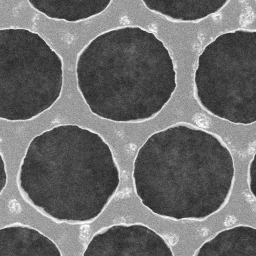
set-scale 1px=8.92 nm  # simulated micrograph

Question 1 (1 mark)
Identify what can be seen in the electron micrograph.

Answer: holes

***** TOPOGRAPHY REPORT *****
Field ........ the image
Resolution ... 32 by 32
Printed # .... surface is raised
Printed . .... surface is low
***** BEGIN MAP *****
####..........####..........####
#####........#######.......#####
########..############...#######
###############..###############
.....#######.......########.....
......#####.........######......
.......###...........####.......
........##...........####.......
........##............###.......
........##............##........
........##............##........
........##............###.......
.......####..........####.......
......#####.........######......
....########.......########.....
######################.#######.#
######.....#########......######
####.........#####.........#####
####..........####..........####
###...........###............###
###...........###............##.
.#.............##............##.
.#.............##............##.
###............##............##.
###...........###...........####
####.........#####..........####
#####........######........#####
#######....#####################
#...##########....###########...
......######........#######.....
.......####..........#####......
.......####..........####.......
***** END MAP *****